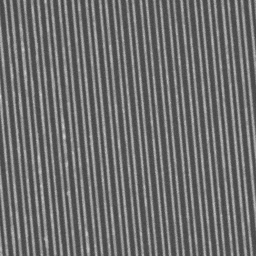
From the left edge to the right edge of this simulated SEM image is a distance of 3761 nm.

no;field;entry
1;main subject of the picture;parallel lines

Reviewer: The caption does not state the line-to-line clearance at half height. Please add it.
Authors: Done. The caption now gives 4.85 pixels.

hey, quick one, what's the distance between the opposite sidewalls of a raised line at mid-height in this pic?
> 29.2 nm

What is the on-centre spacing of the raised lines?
0.0994 um